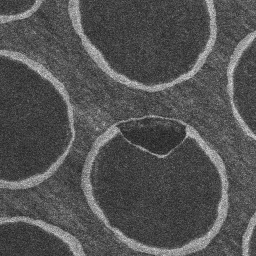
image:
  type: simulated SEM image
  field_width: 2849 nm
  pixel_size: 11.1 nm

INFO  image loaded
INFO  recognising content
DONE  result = raised bodies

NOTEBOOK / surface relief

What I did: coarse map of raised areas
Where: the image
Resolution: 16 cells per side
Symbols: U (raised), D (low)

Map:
UUDDDUUUUUUUUDDD
DDDDDUUUUUUUUDDD
DDDDDUUUUUUUUDDU
UDDDDDUUUUUUUDDU
UUUDDDDUUUUUDDUU
UUUUDDDDDUDDDDUU
UUUUDDDDDDDDDDDU
UUUUDDDDDDDDDDDU
UUUUUDDUDDDDDDDD
UUUUDDUUUDDUUDDD
UUUDDUUUUUUUUUDD
UUDDDUUUUUUUUUDD
DDDDDDUUUUUUUUDD
DDDDDDUUUUUUUUDD
UUUUDDDUUUUUUDDD
UUUUUDDDDUUUDDDU